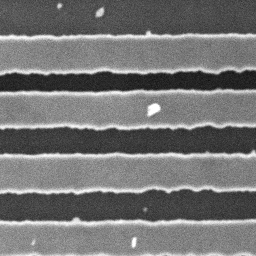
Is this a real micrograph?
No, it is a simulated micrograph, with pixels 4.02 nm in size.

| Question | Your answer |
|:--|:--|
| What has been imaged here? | lines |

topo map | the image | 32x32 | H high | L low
LLLLLLLLLLLLLLLLLLLLLLLLLLLLLLLL
LLLLLLLLLLLLLLLLLLLLLLLLLLLLLLLL
LLLLLLLLLLLLLLLLLLLLLLLLLLLLLLLL
LLLLLLLLLLLLLLLLLLLLLLLLLLLLLLLL
LHLLHHHLHHHHHHHHHHHHHHHHHHHHHHHH
HHHHHHHHHHHHHHHHHHHHHHHHHHHHHHHH
HHHHHHHHHHHHHHHHHHHHHHHHHHHHHHHH
HHHHHHHHHHHHHHHHHHHHHHHHHHHHHHHH
HHHHHHHHHHHHHHHHHHHHHHHHHHHHHHHH
LLLLLLLLLLLLLLLLLLLLLLLLLLLLLLLL
LLLLLLLLLLLLLLLLLLLLLLLLLLLLLLLL
LLHHHLLHHLLLLHHHHHHHHHHHHHHHHHHH
HHHHHHHHHHHHHHHHHHHHHHHHHHHHHHHH
HHHHHHHHHHHHHHHHHHHHHHHHHHHHHHHH
HHHHHHHHHHHHHHHHHHHHHHHHHHHHHHHH
HHHHHHHHHHHHHHHHHHHHHHHHHHHHHHHH
LLLLLLLLLLLLLLLLLLLLLLLLLLLLLLLL
LLLLLLLLLLLLLLLLLLLLLLLLLLLLLLLL
LLLLLLLLLLLLLLLLLLLLLLLLLLLLLLLL
HHHHHHHHHHHHHHHHHHHHHHHHHHHHHHHH
HHHHHHHHHHHHHHHHHHHHHHHHHHHHHHHH
HHHHHHHHHHHHHHHHHHHHHHHHHHHHHHHH
HHHHHHHHHHHHHHHHHHHHHHHHHHHHHHHH
HHHHHHHHHHHHHHHHHHHHHHHHHHHHHHHH
LLLLLLLLLLLLLLLLLLLLLLLLLLLLLLLL
LLLLLLLLLLLLLLLLLLLLLLLLLLLLLLLL
LLLLLLLLLLLLLLLLLLLLLLLLLLLLLLLL
LLLLLLLLLLLLLLLLLHLLLLHLLLLLLLLH
HHHHHHHHHHHHHHHHHHHHHHHHHHHHHHHH
HHHHHHHHHHHHHHHHHHHHHHHHHHHHHHHH
HHHHHHHHHHHHHHHHHHHHHHHHHHHHHHHH
HHHHHHHHHHHHHHHHHHHHHHHHHHHHHHHH